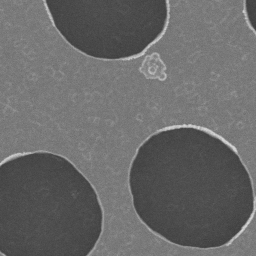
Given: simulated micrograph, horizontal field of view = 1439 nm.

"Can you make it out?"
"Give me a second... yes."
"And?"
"holes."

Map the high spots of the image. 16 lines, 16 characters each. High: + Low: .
+++.......+++++.
+++.......++++++
++++......++++++
++++++..++++++++
++++++++++++++++
++++++++++++++++
++++++++++++++++
++++++++++++++++
++++++++++...+++
+++++++++......+
.....+++.......+
......++........
......++........
......+++.......
......++++.....+
......++++++++++